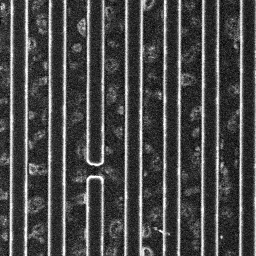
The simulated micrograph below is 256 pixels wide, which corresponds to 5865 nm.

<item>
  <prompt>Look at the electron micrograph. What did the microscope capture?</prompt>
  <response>parallel lines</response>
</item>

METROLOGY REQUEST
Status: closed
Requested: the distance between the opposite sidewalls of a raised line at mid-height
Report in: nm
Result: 352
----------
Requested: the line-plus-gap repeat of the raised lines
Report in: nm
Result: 878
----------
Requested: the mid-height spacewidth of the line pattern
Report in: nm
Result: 527